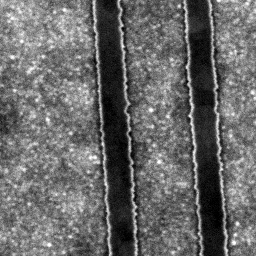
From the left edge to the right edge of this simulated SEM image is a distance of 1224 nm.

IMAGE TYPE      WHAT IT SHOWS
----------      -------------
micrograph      one or a few lines or trenches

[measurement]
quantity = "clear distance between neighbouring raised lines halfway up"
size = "63 pixels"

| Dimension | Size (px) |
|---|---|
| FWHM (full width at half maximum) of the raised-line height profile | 26.3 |